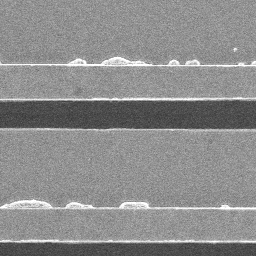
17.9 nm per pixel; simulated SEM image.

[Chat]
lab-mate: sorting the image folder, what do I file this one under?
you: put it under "lines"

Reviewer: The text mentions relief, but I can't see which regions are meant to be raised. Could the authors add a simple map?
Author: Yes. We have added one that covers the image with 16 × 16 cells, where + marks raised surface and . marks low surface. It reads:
++++++++++++++++
++++++++++++++++
++++++++++++++++
++++++++++++++++
++++++++++++++++
++++++++++++++++
................
................
++++++++++++++++
++++++++++++++++
++++++++++++++++
++++++++++++++++
++++++++++++++++
++++++++++++++++
++++++++++++++++
................